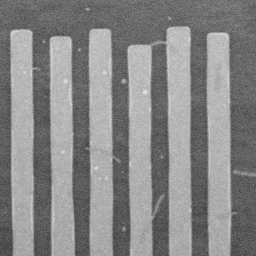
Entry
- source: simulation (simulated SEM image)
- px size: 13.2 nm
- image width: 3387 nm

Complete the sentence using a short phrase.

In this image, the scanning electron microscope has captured groups of lines, slits or small figures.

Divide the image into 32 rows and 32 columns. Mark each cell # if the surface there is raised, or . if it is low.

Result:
................................
................................
................................
.....................##.........
.###.......###.......###..##....
.###..###..###.......###..###...
.###..###..###..###..###..###...
.###...##..###..###..###..###...
.###...##..###..###..###..###...
.###...##..###..###..###..###...
..##..###..###..###..###..###...
.###..###..###..###..###..###...
.###..###..###..###..###..###...
.###..###..###..###..###..###...
.###..###..###..###..###..###...
..##..###..###..###..###..###...
..##..###..###..###..###..###...
..##..###..###..###..###..###...
..##..###..###..###..###..###...
..##...##..###..###..###..###...
..##...##..###..###..###..###...
..##...##..###..###..###..###...
..##...##..###..###..###..###...
..##...##..###..###..###..###...
..##...##..###..###..###..###...
..##...##..###..###..###..###...
..##...##..###..###..###..###...
..##...##..###..###..###..###...
..##...##..###..###..###..###...
..##...##..###..###..###..###...
..##...##..###..###..###..###...
..##...##..###..###..###..###...